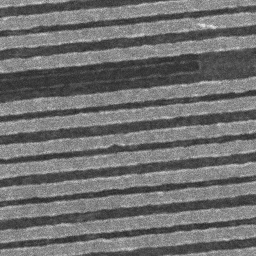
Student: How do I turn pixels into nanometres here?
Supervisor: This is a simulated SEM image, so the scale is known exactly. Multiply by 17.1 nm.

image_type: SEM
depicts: parallel lines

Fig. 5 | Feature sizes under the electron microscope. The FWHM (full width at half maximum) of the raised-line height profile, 0.2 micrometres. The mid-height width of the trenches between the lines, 8.96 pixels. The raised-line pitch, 360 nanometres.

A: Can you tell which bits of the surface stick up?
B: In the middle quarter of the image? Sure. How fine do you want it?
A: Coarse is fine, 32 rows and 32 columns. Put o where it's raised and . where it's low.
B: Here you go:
....................oooooooooooo
..........oooooooooooooooooooooo
ooooooooooooooooooooooooooooo...
oooooooooooooooooo..............
ooooooooo.......................
...........................ooooo
.................ooo.ooooooooooo
........oooooooooooooooooooooooo
ooooooooooooooooooooooooooo.....
oooooooooooooooo.o..............
oooooo....................oooooo
..................oooooooooooooo
......ooooooooooooooooooooooooo.
oooooooooooooooooooooooo........
oooooooooooooo..................
ooooo...........................
.........................ooooooo
................oooooooooooooooo
.....ooooooooooooooooooooooooooo
oooooooooooooooooooooo.oo.......
ooooooooooo.....................
oooo...................ooooooooo
.............ooooooooooooooooooo
..ooooooooooooooooooooooooooooo.
oooooooooooooooooooooo..........
oooooooooooooo..................
.o...........................ooo
.....................ooooooooooo
...........ooooooooooooooooooooo
ooooooooooooooooooooooooooooooo.
ooooooooooooooooo...............
ooooooooo.....................oo